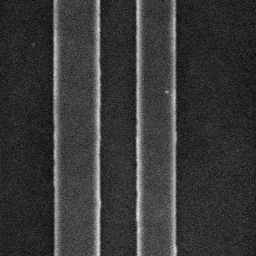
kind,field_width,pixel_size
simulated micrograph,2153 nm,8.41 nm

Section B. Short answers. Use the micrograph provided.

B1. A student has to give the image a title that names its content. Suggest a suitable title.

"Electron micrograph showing lines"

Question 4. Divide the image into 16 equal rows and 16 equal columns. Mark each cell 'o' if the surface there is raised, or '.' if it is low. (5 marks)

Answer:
...oooooooo.....
...oooooooo.....
...oooooooo.....
...oooooooo.....
...oooooooo.....
...oooooooo.....
...oooooooo.....
...oooooooo.....
...oooooooo.....
...oooooooo.....
...oooooooo.....
...oooooooo.....
...oooooooo.....
...oooooooo.....
...oooooooo.....
...oooooooo.....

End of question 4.